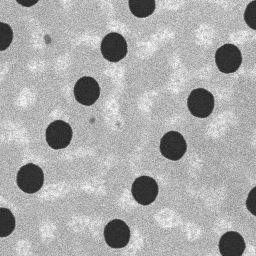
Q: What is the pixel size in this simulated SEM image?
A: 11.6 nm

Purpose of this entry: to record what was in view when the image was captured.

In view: a regular array of holes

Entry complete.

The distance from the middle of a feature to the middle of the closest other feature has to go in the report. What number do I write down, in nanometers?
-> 600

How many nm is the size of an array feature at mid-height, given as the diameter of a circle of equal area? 330